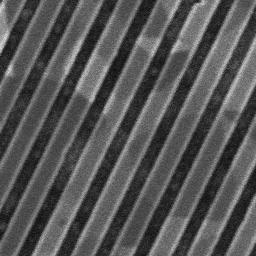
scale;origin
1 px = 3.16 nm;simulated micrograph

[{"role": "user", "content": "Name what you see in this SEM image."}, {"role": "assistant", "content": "parallel lines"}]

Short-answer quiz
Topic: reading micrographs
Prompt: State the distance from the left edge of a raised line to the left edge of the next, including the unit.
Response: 110 nanometers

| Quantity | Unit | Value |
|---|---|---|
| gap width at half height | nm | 49.9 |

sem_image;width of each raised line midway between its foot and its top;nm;61.3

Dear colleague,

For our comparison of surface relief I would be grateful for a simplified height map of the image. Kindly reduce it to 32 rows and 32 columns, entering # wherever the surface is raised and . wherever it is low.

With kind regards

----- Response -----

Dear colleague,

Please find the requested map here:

###..###..###..##...##...##..###
##...##..###..###..###..###..##.
##..###..###..##...##...##..###.
#...##...##..###..###..###..##..
#..###..###..##...##...##..###..
...##...##..###..###..###..##...
..###..###..##...##...##..###..#
..##...##..###..###..###..##...#
.###..###..##...##...##..###..##
.##...##..###..###..###..###..##
###..###..##...##...##..###..###
##...##..###..###..###..##...##.
##..###..###..##...##..###..###.
#...##..###..###..###..###..##..
#..###..##...##...##..###..###..
...##..###..###..###..###..##...
..###..###..##...##..###..###..#
..##..###..###..###..###..##...#
.###..##...##...##..###..###..##
.##..###..###..###..###..##...##
###..###..##...##...##..###..###
##..###..###..###..###..##...##.
##..###..##...##..###..###..###.
#..###..###..###..###..##...##..
#..###..##...##...##..###..###..
...##..###..###..###..##...##...
..###..##...##...##..###..###..#
..##..###..###..###..##...##...#
.###..##...##...##..###..###..##
.##..###..###..###..##...##...##
###..###..##...##..###..###..###
##..###..###..###..###..##...##.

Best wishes